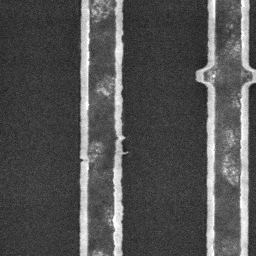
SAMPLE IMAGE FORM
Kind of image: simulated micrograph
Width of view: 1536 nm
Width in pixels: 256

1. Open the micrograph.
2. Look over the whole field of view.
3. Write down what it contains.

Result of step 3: one or a few lines or trenches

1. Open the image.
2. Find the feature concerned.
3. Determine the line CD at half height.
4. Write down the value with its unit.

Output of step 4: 208 nanometers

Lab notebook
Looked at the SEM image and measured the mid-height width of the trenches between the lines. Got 91.9 pixels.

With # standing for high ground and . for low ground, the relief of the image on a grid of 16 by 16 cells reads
.....##......##.
.....##......##.
.....##......##.
.....##......##.
.....##......###
.....##......###
.....##......##.
.....##......##.
.....##......##.
.....##......##.
.....##......##.
.....##......##.
.....##......##.
.....##......##.
.....##......##.
.....##......##.